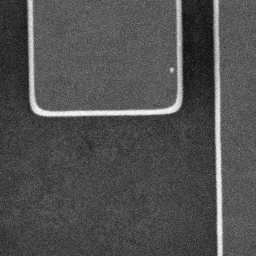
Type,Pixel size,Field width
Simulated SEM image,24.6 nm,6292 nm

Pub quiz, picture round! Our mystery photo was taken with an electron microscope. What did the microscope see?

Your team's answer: groups of lines, slits or small figures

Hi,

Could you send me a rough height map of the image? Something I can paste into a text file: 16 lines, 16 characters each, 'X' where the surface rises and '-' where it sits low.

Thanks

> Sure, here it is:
--XXXXXXXXX---XX
--XXXXXXXXX---XX
--XXXXXXXXX---XX
--XXXXXXXXX---XX
--XXXXXXXXX---XX
--XXXXXXXXX---XX
--XXXXXXXXX---XX
--------------XX
--------------XX
--------------XX
--------------XX
--------------XX
--------------XX
--------------XX
--------------XX
--------------XX